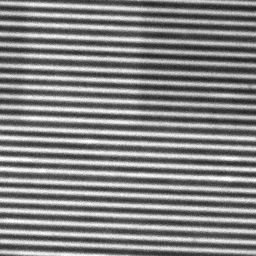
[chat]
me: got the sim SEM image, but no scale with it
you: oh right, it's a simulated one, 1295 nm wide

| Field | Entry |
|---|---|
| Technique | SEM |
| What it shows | parallel lines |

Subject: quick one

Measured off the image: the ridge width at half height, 13.9 nm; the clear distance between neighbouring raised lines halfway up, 37.3 nm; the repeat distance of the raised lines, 52.4 nm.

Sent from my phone